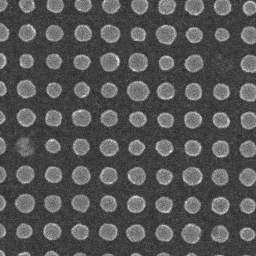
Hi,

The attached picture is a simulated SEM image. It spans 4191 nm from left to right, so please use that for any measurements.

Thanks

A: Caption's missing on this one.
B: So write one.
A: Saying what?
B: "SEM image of a regular array of raised bodies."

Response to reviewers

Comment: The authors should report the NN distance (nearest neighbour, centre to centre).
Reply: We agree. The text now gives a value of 452 nanometers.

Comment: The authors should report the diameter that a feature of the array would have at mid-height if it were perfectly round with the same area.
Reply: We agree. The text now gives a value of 261 nm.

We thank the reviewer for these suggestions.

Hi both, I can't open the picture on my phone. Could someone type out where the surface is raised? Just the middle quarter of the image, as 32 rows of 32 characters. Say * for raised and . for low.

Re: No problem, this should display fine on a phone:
...***....****..*****...***...**
..........***....***...........*
................................
................................
................................
...***....***...*****...***....*
...***...****...*****..****....*
...***....***...*****...***...**
.................***....***....*
................................
................................
................................
..****....***....***.....*.....*
..*****..****...****....***...**
..****...****....***....***...**
..................*.....***....*
................................
................................
................................
...***....***....**.....**.....*
..****...****...****...****...**
..****...****...****...****...**
...**.....***....**.....**.....*
................................
................................
................................
...***....***....***....*......*
..****...****...****...****...**
..****...****...****...****...**
...***....***....***....**....**
................................
................................